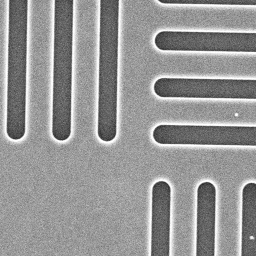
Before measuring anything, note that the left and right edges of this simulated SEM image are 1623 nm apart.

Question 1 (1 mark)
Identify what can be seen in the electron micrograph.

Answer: groups of lines, slits or small figures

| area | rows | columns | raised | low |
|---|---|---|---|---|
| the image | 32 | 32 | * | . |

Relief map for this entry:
*...***..***...******...........
*...***..***...*****************
*...***..***...*****************
*..****..***...*****************
*..****..***...*****............
*..****..***...****.............
*..****..***...*************....
*..****..***...*****************
*..****..***...*****************
*..****..***...*****************
*..****..***...****.............
*..***...***...****.............
*..***...***...*****************
*..***...***...*****************
*..***...***...*****************
*..***...***...*****..**********
*..***...***...****.............
*******.*****.*****.............
********************************
********************************
********************************
********************************
********************************
*******************..****..***..
*******************..****..***..
*******************..****..***..
*******************..****..***..
*******************..****..***..
*******************..****..***..
*******************..***...***..
*******************..***...***..
*******************..***...***..